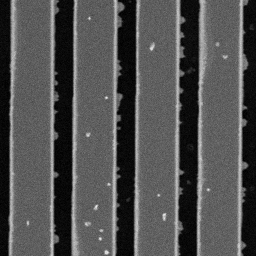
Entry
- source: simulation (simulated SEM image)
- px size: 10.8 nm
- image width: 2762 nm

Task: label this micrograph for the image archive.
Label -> lines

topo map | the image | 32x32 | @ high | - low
--@@@@@--@@@@@@--@@@@@---@@@@@--
--@@@@@--@@@@@@--@@@@@---@@@@@--
-@@@@@@--@@@@@@--@@@@@---@@@@@--
--@@@@@--@@@@@@--@@@@@---@@@@@--
-@@@@@@--@@@@@@--@@@@@---@@@@@--
-@@@@@@--@@@@@@--@@@@@---@@@@@--
-@@@@@@--@@@@@@--@@@@@---@@@@@--
-@@@@@@--@@@@@@--@@@@@---@@@@@--
-@@@@@@--@@@@@@--@@@@@---@@@@@--
-@@@@@@--@@@@@@--@@@@@---@@@@@--
-@@@@@@--@@@@@@--@@@@@---@@@@@--
-@@@@@@--@@@@@@--@@@@@---@@@@@--
-@@@@@@--@@@@@@--@@@@@---@@@@@--
-@@@@@@--@@@@@@--@@@@@---@@@@@--
-@@@@@@--@@@@@@--@@@@@---@@@@@--
-@@@@@@--@@@@@@--@@@@@---@@@@@--
-@@@@@@--@@@@@@--@@@@@---@@@@@--
-@@@@@@--@@@@@@--@@@@@---@@@@@--
-@@@@@@--@@@@@@--@@@@@---@@@@@--
-@@@@@@--@@@@@---@@@@@---@@@@@--
-@@@@@@--@@@@@---@@@@@---@@@@@--
-@@@@@@--@@@@@---@@@@@---@@@@@--
-@@@@@@--@@@@@---@@@@@---@@@@@--
-@@@@@@--@@@@@---@@@@@---@@@@@--
-@@@@@@--@@@@@---@@@@@---@@@@@--
-@@@@@@--@@@@@---@@@@@---@@@@@--
-@@@@@@--@@@@@---@@@@@---@@@@@--
-@@@@@@--@@@@@---@@@@@---@@@@@--
-@@@@@@--@@@@@---@@@@@---@@@@@--
-@@@@@@--@@@@@---@@@@@---@@@@@--
-@@@@@@--@@@@@---@@@@@---@@@@@--
-@@@@@@--@@@@@---@@@@@---@@@@@--